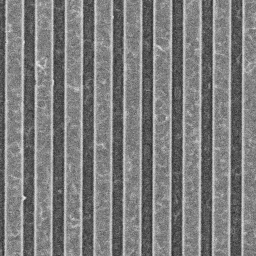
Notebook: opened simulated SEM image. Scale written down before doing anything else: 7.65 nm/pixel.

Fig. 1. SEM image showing parallel lines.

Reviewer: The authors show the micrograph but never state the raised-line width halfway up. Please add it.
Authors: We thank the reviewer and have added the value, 136 nm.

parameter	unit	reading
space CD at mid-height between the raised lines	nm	88.9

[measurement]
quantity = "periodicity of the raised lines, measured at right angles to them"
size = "0.227 um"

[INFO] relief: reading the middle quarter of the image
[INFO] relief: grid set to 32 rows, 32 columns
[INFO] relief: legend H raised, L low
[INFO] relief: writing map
HHHHHLLLHHHHLLLHHHHLLLLHHHHLLLHH
HHHHLLLLHHHHLLLHHHHLLLLHHHHLLLHH
HHHHLLLLHHHHLLLHHHHLLLLHHHHLLLHH
HHHHLLLLHHHHLLLHHHHLLLLHHHHLLLHH
HHHHLLLLHHHHLLLHHHHLLLLHHHHLLLHH
HHHHLLLLHHHHLLLHHHHLLLLHHHHLLLHH
HHHHLLLLHHHHLLLHHHHLLLLHHHHLLLHH
HHHHLLLLHHHHLLLHHHHLLLLHHHHLLLHH
HHHHLLLLHHHHLLLHHHHLLLHHHHHLLLHH
HHHHLLLLHHHHLLLHHHHLLLHHHHHLLLHH
HHHHLLLLHHHHLLLHHHHLLLHHHHHLLLHH
HHHHLLLLHHHHLLLHHHHLLLHHHHHLLLHH
HHHHLLLLHHHHLLLHHHHLLLHHHHHLLLHH
HHHHLLLLHHHHLLLHHHHLLLHHHHHLLLHH
HHHHLLLLHHHHLLLHHHHLLLHHHHHLLLHH
HHHHLLLLHHHHLLLHHHHLLLHHHHHLLLHH
HHHHLLLLHHHHLLLHHHHLLLHHHHHLLLHH
HHHHLLLLHHHHLLLHHHHLLLHHHHHLLLHH
HHHHLLLLHHHHLLLHHHHLLLHHHHHLLLHH
HHHHLLLLHHHHLLLHHHHLLLHHHHHLLLHH
HHHHLLLLHHHHLLLHHHHLLLHHHHHLLLHH
HHHHLLLLHHHHLLLHHHHLLLHHHHHLLLHH
HHHHLLLLHHHHLLLHHHHLLLHHHHHLLLHH
HHHHLLLLHHHHLLLHHHHLLLHHHHHLLLHH
HHHHLLLLHHHHLLLHHHHLLLHHHHHLLLHH
HHHHLLLLHHHHLLLHHHHLLLHHHHHLLLHH
HHHHLLLLHHHHLLLHHHHLLLHHHHHLLLHH
HHHHLLLLHHHHLLLHHHHLLLHHHHHLLLHH
HHHHLLLLHHHHLLLHHHHLLLHHHHHLLLHH
HHHHLLLLHHHHLLLHHHHLLLHHHHHLLLHH
HHHHLLLLHHHHLLLHHHHLLLHHHHHLLLHH
HHHHLLLLHHHHLLLHHHHLLLHHHHHLLLHH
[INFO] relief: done